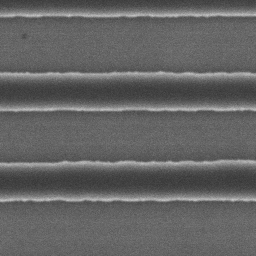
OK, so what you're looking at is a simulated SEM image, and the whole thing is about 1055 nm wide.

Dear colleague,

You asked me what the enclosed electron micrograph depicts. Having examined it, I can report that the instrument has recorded lines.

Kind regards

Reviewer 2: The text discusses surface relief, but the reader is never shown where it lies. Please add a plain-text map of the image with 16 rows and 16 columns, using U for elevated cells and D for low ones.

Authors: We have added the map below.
UUUUUUUUUUUUUUUU
DDDDDDDDDDDDDDDD
DDDDDDDDDDDDDDDD
DDDDDDDDDDDDDDDD
DDDDDDDDDDDDDDDD
UUUUUUUUUUUUUUUU
UUUUUUUUUUUUUUUU
DDDDDDDDDDDDDDDD
DDDDDDDDDDDDDDDD
DDDDDDDDDDDDDDDD
UUUUUUUUUUUUUUUU
UUUUUUUUUUUUUUUU
UUUDUUUUUUUDUDUU
DDDDDDDDDDDDDDDD
DDDDDDDDDDDDDDDD
DDDDDDDDDDDDDDDD